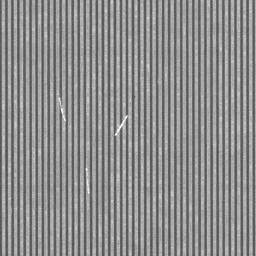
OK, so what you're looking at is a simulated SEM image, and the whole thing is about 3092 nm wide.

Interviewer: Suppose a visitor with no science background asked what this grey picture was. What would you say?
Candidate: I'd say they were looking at parallel lines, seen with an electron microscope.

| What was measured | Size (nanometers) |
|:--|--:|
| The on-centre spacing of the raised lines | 72.8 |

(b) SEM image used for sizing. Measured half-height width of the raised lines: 0.0332 µm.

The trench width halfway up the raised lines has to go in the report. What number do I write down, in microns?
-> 0.0393